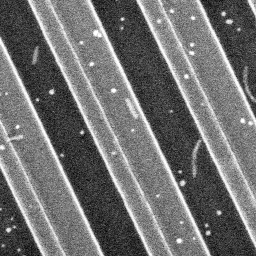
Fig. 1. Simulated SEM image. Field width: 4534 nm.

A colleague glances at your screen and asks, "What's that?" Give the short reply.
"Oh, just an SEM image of lines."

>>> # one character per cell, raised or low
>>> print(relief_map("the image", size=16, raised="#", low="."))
..####...####...
...###...####...
...####...####..
...####...####..
#...####...###..
#...####...####.
##...####...###.
##...####...####
###...####...###
###...####...###
####...###....##
.###...####...##
.####...###....#
..###...####...#
..####...###....
...###...####...